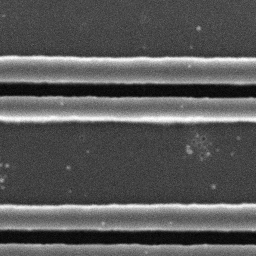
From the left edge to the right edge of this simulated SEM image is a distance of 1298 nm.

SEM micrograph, lines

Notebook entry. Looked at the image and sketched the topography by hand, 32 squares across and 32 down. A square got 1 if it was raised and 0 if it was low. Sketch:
00000000000000000000000000000000
00000000000000000000000000000000
00000000000000000000000000000000
00000000000000000000000000000000
00000000000000000000000000000000
00000000000000000000000000000000
00000000000000000000000000000000
11111111111111011111111110111110
11111111111111111111111111111111
11111111111111111111111111111111
00000000000000000000000000000000
00000000000000000000000000000000
11111111111111111111111111111111
11111111111111111111111111111111
11111111111111111111111111111111
00000000000000000000000000000000
00000000000000000000000000000000
00000000000000000000000000000000
00000000000000000000000000000000
00000000000000000000000000000000
00000000000000000000000000000000
00000000000000000000000000000000
00000000000000000000000000000000
00000000000000000000000000000000
00000000000000000000000000000000
00000000000000000000000000000000
11111111111111111111111111111111
11111111111111111111111111111111
11111111111111111111111111111111
00000000000000000000000000000000
00000000000000000000000000000000
11111111111111111111111111111111